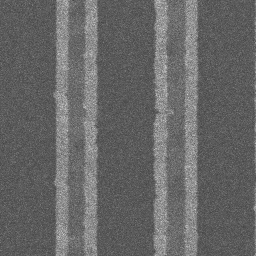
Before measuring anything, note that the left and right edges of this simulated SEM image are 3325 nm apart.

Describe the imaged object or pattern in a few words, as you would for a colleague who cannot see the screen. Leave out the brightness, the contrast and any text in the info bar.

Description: one or a few lines or trenches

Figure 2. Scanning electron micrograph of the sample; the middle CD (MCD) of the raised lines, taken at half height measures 404 nm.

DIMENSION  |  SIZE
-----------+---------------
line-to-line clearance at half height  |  888 nm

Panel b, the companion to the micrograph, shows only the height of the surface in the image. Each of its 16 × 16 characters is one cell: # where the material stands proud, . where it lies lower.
....##....##....
....##....##....
....##....##....
....##....##....
....##....##....
....##....##....
....##....##....
....##....##....
....##....##....
....##....##....
....##....##....
....##....##....
....##....##....
....##....##....
....##....##....
....##....##....